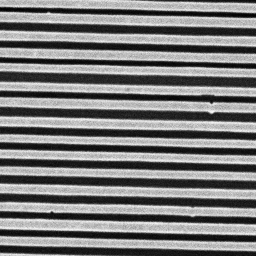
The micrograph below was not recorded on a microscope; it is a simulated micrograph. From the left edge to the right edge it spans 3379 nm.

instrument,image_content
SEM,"parallel lines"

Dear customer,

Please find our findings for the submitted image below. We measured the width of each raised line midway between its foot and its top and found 0.12 um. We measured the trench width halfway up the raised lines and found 107 nanometres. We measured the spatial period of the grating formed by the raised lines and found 226 nanometres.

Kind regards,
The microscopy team